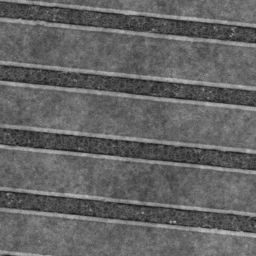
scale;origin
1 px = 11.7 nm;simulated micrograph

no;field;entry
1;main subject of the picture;one or a few lines or trenches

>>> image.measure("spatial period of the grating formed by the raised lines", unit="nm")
737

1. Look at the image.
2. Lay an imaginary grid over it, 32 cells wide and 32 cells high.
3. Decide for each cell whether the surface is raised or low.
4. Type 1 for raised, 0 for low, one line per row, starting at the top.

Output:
00000011111111111111111111111111
00000000000000011111111111111111
00000000000000000000000001111111
11111111110000000000000000000000
11111111111111111111000000000000
11111111111111111111111111111000
11111111111111111111111111111111
11111111111111111111111111111111
00000001111111111111111111111111
00000000000000000111111111111111
11000000000000000000000000111111
11111111111100000000000000000000
11111111111111111111100000000000
11111111111111111111111111111110
11111111111111111111111111111111
11111111111111111111111111111111
00000001111111111111111111111111
00000000000000000111111111111111
11000000000000000000000000011111
11111111111100000000000000000000
11111111111111111111110000000000
11111111111111111111111111111110
11111111111111111111111111111111
11111111111111111111111111111111
00000000001111111111111111111111
00000000000000000001111111111111
11100000000000000000000000000111
11111111111100000000000000000000
11111111111111111111110000000000
11111111111111111111111111111111
11111111111111111111111111111111
11111111111111111111111111111111